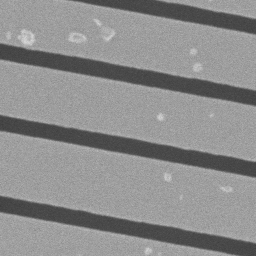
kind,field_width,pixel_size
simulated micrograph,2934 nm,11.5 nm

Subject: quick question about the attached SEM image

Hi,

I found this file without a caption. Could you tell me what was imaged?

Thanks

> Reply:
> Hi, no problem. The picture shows lines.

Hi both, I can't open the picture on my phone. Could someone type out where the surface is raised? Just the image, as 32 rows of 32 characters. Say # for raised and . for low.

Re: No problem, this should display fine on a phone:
###########............#########
################...........#####
######################..........
###########################.....
################################
.###############################
......##########################
............####################
######...........###############
###########............#########
#################...........####
######################..........
############################....
################################
.###############################
......##########################
............####################
######............##############
############..........##########
#################............###
#######################.........
############################....
################################
################################
.###############################
......##########################
...........#####################
#####...........################
###########...........##########
################............####
######################..........
###########################.....